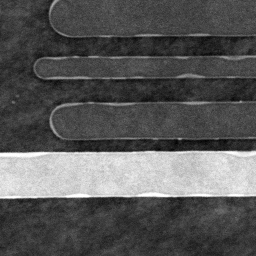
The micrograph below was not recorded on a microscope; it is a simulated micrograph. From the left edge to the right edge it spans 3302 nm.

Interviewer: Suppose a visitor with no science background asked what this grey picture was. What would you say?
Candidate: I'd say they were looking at groups of lines, slits or small figures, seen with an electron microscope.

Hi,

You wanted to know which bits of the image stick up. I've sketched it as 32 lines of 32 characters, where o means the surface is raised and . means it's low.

.......ooooooooooooooooooooooooo
......oooooooooooooooooooooooooo
......oooooooooooooooooooooooooo
.......ooooooooooooooooooooooooo
.........oo.....................
................................
................................
.....ooooooooooooooooooooooooooo
....oooooooooooooooooooooooooooo
.....oooooooooooooooooo..ooooooo
................................
................................
................................
.......ooooooooooooooooooooooooo
......oooooooooooooooooooooooooo
......oooooooooooooooooooooooooo
.......ooooooooooooooooooooooooo
................................
................................
o...oooooooooooooooooooooooooooo
oooooooooooooooooooooooooooooooo
oooooooooooooooooooooooooooooooo
oooooooooooooooooooooooooooooooo
oooooooooooooooooooooooooooooooo
oooooooooooooooooo..oooo........
................................
................................
................................
................................
................................
................................
................................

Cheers